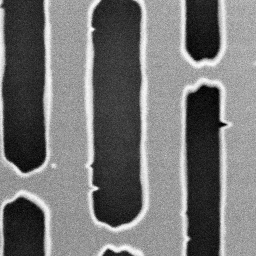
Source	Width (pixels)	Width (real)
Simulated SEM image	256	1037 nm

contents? one or a few lines or trenches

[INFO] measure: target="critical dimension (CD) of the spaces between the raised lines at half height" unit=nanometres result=175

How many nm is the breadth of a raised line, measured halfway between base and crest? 178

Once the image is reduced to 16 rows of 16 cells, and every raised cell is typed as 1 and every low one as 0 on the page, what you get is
0001110001110011
0001110001110011
0001110001110011
0001110001110011
0001110001111111
0001110001110011
0001110001110011
0001110001110011
0001110001110011
0001110001110011
1011110001110011
1111110001110011
1011110001110011
0001110001110011
0001111111110011
0001111111110011